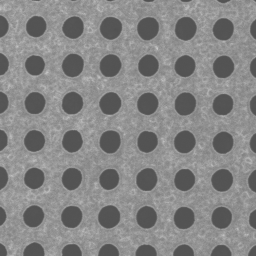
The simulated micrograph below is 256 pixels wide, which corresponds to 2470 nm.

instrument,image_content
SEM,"a regular array of holes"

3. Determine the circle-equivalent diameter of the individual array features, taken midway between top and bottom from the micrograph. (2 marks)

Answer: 212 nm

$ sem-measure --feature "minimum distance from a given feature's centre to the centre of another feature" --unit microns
0.361